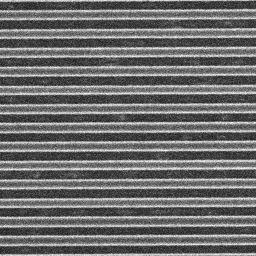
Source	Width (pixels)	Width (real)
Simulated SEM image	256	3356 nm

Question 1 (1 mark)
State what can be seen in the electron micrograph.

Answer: parallel lines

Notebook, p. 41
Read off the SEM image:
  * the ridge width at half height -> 0.118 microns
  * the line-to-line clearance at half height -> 0.131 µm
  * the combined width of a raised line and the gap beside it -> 246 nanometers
